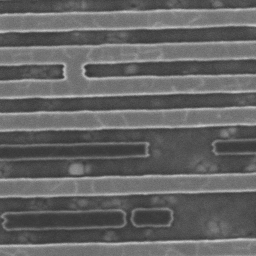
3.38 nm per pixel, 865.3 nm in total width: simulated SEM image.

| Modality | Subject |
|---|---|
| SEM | parallel lines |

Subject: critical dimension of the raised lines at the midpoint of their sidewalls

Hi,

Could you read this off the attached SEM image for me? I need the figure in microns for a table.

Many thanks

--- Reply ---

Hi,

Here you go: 0.0583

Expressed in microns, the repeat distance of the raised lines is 0.112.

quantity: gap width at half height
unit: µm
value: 0.0519